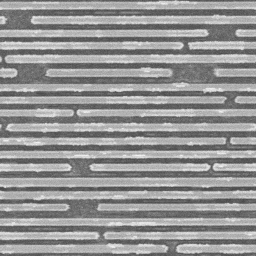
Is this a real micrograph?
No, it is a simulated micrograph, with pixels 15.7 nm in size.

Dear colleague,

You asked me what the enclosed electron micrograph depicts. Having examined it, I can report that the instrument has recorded parallel lines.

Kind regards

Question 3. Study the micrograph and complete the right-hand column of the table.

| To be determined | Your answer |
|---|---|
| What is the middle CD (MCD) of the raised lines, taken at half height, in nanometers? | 110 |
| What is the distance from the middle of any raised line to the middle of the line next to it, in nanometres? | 212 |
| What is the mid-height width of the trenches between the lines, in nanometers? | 96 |